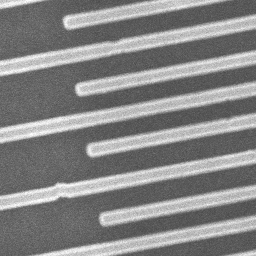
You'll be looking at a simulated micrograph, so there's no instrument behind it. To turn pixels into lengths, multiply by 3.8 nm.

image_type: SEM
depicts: parallel lines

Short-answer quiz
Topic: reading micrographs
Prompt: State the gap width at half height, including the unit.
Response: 79 nm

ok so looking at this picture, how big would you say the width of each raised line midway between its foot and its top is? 43.1 nm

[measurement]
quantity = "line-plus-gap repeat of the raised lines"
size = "32.9 pixels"